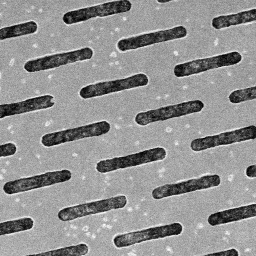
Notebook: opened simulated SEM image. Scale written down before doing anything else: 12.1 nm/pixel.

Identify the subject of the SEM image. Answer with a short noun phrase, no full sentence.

a regular array of holes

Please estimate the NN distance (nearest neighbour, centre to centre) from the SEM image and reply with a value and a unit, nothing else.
60.9 pixels